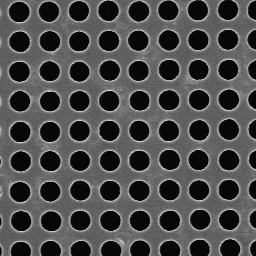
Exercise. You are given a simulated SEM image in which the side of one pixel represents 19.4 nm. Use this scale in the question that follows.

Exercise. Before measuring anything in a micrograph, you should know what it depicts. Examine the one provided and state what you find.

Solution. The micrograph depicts a regular array of holes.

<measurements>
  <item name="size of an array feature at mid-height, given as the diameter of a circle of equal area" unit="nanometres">394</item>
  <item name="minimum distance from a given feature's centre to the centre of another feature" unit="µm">0.57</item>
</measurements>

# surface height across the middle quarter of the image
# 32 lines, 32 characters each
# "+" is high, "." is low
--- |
++....+++.....++.....+++....+++.
+.....+++.....++.....++......++.
+.....+++.....++.....+++.....++.
++....++++...++++....++++...++++
++++++++++++++++++++++++++++++++
++++++++++++++++++++++++++++++++
++++++++++++++++++++++++++++++++
++....+++....++++....+++....+++.
+.....+++.....+++....+++.....++.
+......++.....++.....+++.....++.
+.....+++....++++....+++.....+++
++...+++++...+++++..+++++..+++++
++++++++++++++++++++++++++++++++
++++++++++++++++++++++++++++++++
+++..+++++...+++++..+++++...++++
++....+++.....+++....+++....+++.
+......++.....++.....+++.....++.
++....+++.....++.....+++.....+++
++....++++...++++....+++....++++
++++++++++++++++++++++++++++++++
++++++++++++++++++++++++++++++++
++++++++++++++++++++++++++.+++++
++....++++...++++....+++....++++
++....+++.....++.....+++.....++.
+.....+++.....++.....+++.....++.
++....+++.....++.....+++....++++
+++..+++++...+++++..++++++++++++
++++++++++++++++++++++++++++++++
++++++++++++++++++++++++++++++++
+++..+++++...++++...+++++...++++
++....+++.....++.....+++.....++.
+......++.....++......++.....++.